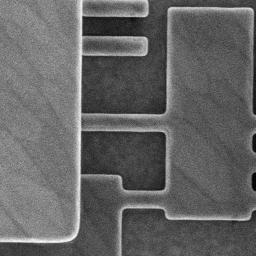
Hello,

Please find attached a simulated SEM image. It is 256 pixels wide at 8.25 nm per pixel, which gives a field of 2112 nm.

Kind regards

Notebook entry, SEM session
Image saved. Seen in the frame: wiring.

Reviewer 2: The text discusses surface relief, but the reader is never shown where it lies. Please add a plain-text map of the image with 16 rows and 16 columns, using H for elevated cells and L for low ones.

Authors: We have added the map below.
HHHHHLLLLLLLLLLL
HHHHHLLLLLLLLLLL
HHHHHLLLLLLLLLLL
HHHHHLLLLLLLLLLL
HHHHHLLLLLLLLLLL
HHHHHLLLLLLLLLLL
HHHHHLLLLLLLLLLL
HHHHHLLLLLLLLLLL
HHHHHLLLLLLLLLLL
HHHHHLLLLLLLLLLL
HHHHHLLLLLLLLLLL
HHHHHLLLLLLLLLLL
HHHHHLLLLLLLLLLL
HHHHHLLLLLLLLLLL
HHHHHLLLLLLLLLLL
LLLLLLLLLLLLLLLL